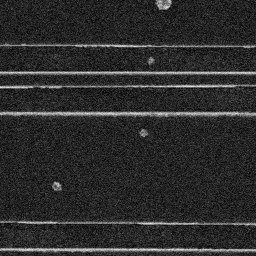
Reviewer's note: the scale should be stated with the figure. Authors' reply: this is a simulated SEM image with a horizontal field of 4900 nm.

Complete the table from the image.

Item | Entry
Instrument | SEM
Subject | lines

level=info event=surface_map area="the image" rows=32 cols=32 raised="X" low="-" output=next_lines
XXXXXXXXXXXXXXXXXXXXXXXXXXXXXXXX
XXXXXXXXXXXXXXXXXXXXXXXXXXXXXXXX
XXXXXXXXXXXXXXXXXXXXXXXXXXXXXXXX
XXXXXXXXXXXXXXXXXXXXXXXXXXXXXXXX
XXXXXXXXXXXXXXXXXXXXXXXXXXXXXXXX
XXXXXXXXXXXXXXXXXXXXXXXXXXXXXXXX
--------------------------------
--------------------------------
--------------------------------
XXXXXXXXXXXXXXXXXXXXXXXXXXXXXXXX
XXXXXXXXXXXXXXXXXXXXXXXXXXXXXXXX
--------------------------------
--------------------------------
--------------------------------
XXXXXXXXXXXXXXXXXXXXXXXXXXXXXXXX
XXXXXXXXXXXXXXXXXXXXXXXXXXXXXXXX
XXXXXXXXXXXXXXXXXXXXXXXXXXXXXXXX
XXXXXXXXXXXXXXXXXXXXXXXXXXXXXXXX
XXXXXXXXXXXXXXXXXXXXXXXXXXXXXXXX
XXXXXXXXXXXXXXXXXXXXXXXXXXXXXXXX
XXXXXXXXXXXXXXXXXXXXXXXXXXXXXXXX
XXXXXXXXXXXXXXXXXXXXXXXXXXXXXXXX
XXXXXXXXXXXXXXXXXXXXXXXXXXXXXXXX
XXXXXXXXXXXXXXXXXXXXXXXXXXXXXXXX
XXXXXXXXXXXXXXXXXXXXXXXXXXXXXXXX
XXXXXXXXXXXXXXXXXXXXXXXXXXXXXXXX
XXXXXXXXXXXXXXXXXXXXXXXXXXXXXXXX
XXXXXXXXXXXXXXXXXXXXXXXXXXXXXXXX
--------------------------------
--------------------------------
--------------------------------
XXXXXXXXXXXXXXXXXXXXXXXXXXXXXXXX